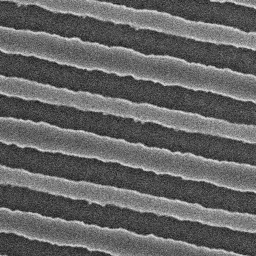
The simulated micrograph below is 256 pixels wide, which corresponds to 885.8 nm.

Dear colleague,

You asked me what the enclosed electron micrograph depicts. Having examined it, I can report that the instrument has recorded lines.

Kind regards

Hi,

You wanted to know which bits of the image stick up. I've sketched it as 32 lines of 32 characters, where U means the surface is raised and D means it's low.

DDDDUUUUUUUUUUDDDDDDDDDDDDDDDDUU
DDDDDDDUUUUUUUUUUUUUDDDDDDDDDDDD
DDDDDDDDDDDDDUUUUUUUUUUDDDDDDDDD
UDDDDDDDDDDDDDDDDUUUUUUUUUUUUDDD
UUUUUUUDDDDDDDDDDDDDDDDUUUUUUUUU
UUUUUUUUUUUUDDDDDDDDDDDDDDDDUUUU
UUUUUUUUUUUUUUUUUDDDDDDDDDDDDDDD
DDDDDDUUUUUUUUUUUUUUUUUDDDDDDDDD
DDDDDDDDDDUUUUUUUUUUUUUUUUUDDDDD
DDDDDDDDDDDDDDDDUUUUUUUUUUUUUUUU
UUUUUDDDDDDDDDDDDDDDUUUUUUUUUUUU
UUUUUUUUUUUDDDDDDDDDDDDDDDDUUUUU
DDDDUUUUUUUUUUUUDDDDDDDDDDDDDDUU
DDDDDDDDDDUUUUUUUUUUDDDDDDDDDDDD
DDDDDDDDDDDDDDDUUUUUUUUUUDDDDDDD
UUUUUUDDDDDDDDDDDDDDUUUUUUUUUDDD
UUUUUUUUUUUDDDDDDDDDDDDDDUUUUUUU
UUUUUUUUUUUUUUUDDDDDDDDDDDDDDDUU
DDDDUUUUUUUUUUUUUUUUDDDDDDDDDDDD
DDDDDDDDDDUUUUUUUUUUUUUUUDDDDDDD
DDDDDDDDDDDDDDDUUUUUUUUUUUUUUUDD
UUUDDDDDDDDDDDDDDDDUUUUUUUUUUUUU
UUUUUUUUDDDDDDDDDDDDDDDDUUUUUUUU
DDDDUUUUUUUUUUDDDDDDDDDDDDDDUUUU
DDDDDDDDUUUUUUUUUUUDDDDDDDDDDDDD
DDDDDDDDDDDDUDUUUUUUUUUUUDDDDDDD
UUUDDDDDDDDDDDDDDDDUUUUUUUUUUDDD
UUUUUUUUDDDDDDDDDDDDDDDUUUUUUUUU
UUUUUUUUUUUUUDDDDDDDDDDDDDDDDUUU
DDDUUUUUUUUUUUUUUUUDDDDDDDDDDDDD
DDDDDDDUUUUUUUUUUUUUUUUUDDDDDDDD
DDDDDDDDDDDDDUUUUUUUUUUUUUUUUDDD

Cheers